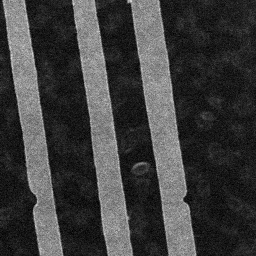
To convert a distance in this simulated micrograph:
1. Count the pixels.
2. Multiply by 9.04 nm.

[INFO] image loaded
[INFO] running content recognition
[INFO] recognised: one or a few lines or trenches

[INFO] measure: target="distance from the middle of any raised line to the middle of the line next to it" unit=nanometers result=586